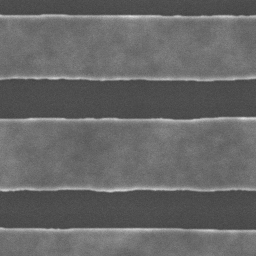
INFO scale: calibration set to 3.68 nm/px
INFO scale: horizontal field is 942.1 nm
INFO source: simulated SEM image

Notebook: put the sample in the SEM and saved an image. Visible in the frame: lines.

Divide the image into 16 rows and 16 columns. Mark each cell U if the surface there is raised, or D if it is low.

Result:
DDDDDDDDDDDDDDDD
UUUUUUUUUUUUUUUU
UUUUUUUUUUUUUUUU
UUUUUUUUUUUUUUUU
UUUUUUUUUUUUUUUU
DDDDDDDDDDDDDDDD
DDDDDDDDDDDDDDDD
UUUUUUUUUUUDUUUU
UUUUUUUUUUUUUUUU
UUUUUUUUUUUUUUUU
UUUUUUUUUUUUUUUU
UUUUUUUUUUUUUUUU
DDDDDDDDDDDDDDDD
DDDDDDDDDDDDDDDD
UUUUUUUUUUUUUUUU
UUUUUUUUUUUUUUUU